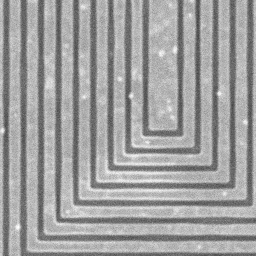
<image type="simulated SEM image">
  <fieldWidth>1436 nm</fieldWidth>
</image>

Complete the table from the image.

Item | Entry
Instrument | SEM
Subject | groups of lines, slits or small figures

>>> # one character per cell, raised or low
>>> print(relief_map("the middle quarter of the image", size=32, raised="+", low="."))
++..++..+++..++..++..+++++++..++
++..++..+++..++..++..+++++++..++
++..++..+++..++..++..+++++++..++
++..++..+++..++..++..+++++++..++
++..++..+++..++..++..+++++++..++
++..++..+++..++..++..+++++++..++
++..++..+++..++..+++.+++++++..++
++..++..+++..++..+++.+++++++..++
++..++..+++..++..+++.+++++++..++
++..++..+++..++..+++.+++++++..++
++..++..+++..++..++..+++++++..++
++..++..+++..++..++..+++++++..++
++..++..+++..++..++..+++++++..++
++..++..+++..++..++..+++++++..++
++..++..+++..++..++..+++++++..++
++..++..+++..++..++..+++++++..++
++..++..+++..++..++...........++
++..++..+++..++..++...........++
++..++..+++..++..+++++++++++++++
++..++..+++..++..+++++++++++++++
++..++..+++..++..+++++++++++++++
++..++..+++..++.................
++..++..+++..++.................
++..++..+++..+++++++++++++++++++
++..++..+++..+++++++++++++++++++
++..++..+++.....................
++..++..+++.....................
++..++..++++++++++++++++++++++++
++..++..++++++++++++++++++++++++
++..++.........................+
++..++..........................
++..+++.........................